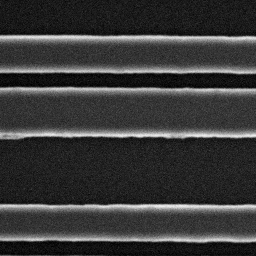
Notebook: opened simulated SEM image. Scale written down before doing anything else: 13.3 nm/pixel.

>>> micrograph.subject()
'lines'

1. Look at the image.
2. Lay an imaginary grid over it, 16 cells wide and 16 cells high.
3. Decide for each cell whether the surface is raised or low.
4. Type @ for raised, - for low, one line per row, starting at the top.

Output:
----------------
----------------
@@@@@@@@@@@@@@@@
@@@@@@@@@@@@@@@@
@@@@@@@@@@@@@@@@
@@@@@@@@@@@@@@@@
@@@@@@@@@@@@@@@@
@@@@@@@@@@@@@@@@
@@------@-@@--@@
----------------
----------------
----------------
----------------
@@@@@@@@@@@@@@@@
@@@@@@@@@@@@@@@@
@@@@@@@@@@@@@@@@